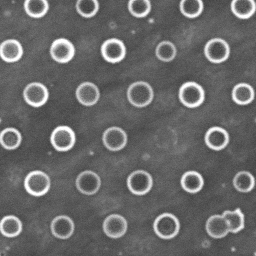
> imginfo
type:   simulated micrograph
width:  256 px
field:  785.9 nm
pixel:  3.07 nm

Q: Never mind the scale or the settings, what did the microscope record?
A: a regular array of raised bodies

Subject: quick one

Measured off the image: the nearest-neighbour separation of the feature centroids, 155 nm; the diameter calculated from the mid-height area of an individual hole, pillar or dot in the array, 72.3 nm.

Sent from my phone